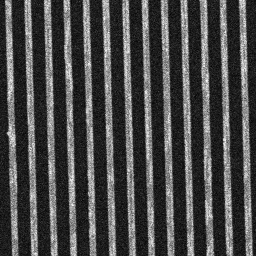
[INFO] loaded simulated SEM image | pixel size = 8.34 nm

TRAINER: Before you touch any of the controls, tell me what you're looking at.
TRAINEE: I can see parallel lines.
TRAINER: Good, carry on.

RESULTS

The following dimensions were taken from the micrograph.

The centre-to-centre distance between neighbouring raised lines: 163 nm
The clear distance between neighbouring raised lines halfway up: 102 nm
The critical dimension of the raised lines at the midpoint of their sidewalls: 55.3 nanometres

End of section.